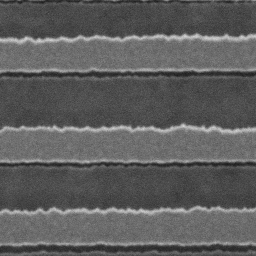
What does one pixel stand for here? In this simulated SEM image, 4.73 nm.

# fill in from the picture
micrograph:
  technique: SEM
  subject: lines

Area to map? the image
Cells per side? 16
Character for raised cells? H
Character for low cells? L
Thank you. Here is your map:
LLLLLLLLLLLLLLLL
LLLLLLLLLLLLLLLL
HHHHHHHHHHHHHHHH
HHHHHHHHHHHHHHHH
LLLLLLLLLLLLLLLL
LLLLLLLLLLLLLLLL
LLLLLLLLLLLLLLLL
LLLLLLLLLLLLLLLL
HHHHHHHHHHHHHHHH
HHHHHHHHHHHHHHHH
LLLLLLLLLLLLLLLL
LLLLLLLLLLLLLLLL
LLLLLLLLLLLLLLLL
HHHHHHHHHHHHHHHH
HHHHHHHHHHHHHHHH
LLLLLLLLLLLLLLLL